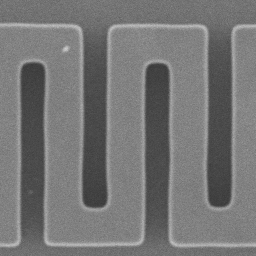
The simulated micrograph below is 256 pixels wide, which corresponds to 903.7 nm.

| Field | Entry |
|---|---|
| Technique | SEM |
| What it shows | groups of lines, slits or small figures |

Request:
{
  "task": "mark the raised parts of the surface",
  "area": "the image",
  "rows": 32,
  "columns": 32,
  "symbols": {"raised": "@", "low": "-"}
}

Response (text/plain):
--------------------------------
--------------------------------
--------------------------------
@@@@@@@@@@----@@@@@@@@@@@@---@@@
@@@@@@@@@@----@@@@@@@@@@@@---@@@
@@@@@@@@@@----@@@@@@@@@@@@---@@@
@@@@@@@@@@----@@@@@@@@@@@@---@@@
@@@@@@@@@@----@@@@@@@@@@@@---@@@
@@@---@@@@----@@@@---@@@@@---@@@
@@@---@@@@----@@@@---@@@@@---@@@
@@@---@@@@---@@@@@---@@@@@---@@@
@@@---@@@@---@@@@@---@@@@@---@@@
@@@---@@@@---@@@@@---@@@@@---@@@
@@@---@@@@---@@@@@---@@@@@---@@@
@@@---@@@@---@@@@@---@@@@@---@@@
@@@---@@@@---@@@@@---@@@@@---@@@
@@@---@@@@---@@@@@---@@@@@---@@@
@@@---@@@@---@@@@@---@@@@@---@@@
@@@---@@@@---@@@@@---@@@@@---@@@
@@@---@@@@---@@@@@---@@@@@---@@@
@@@---@@@@---@@@@@---@@@@@---@@@
@@@---@@@@---@@@@@---@@@@@---@@@
@@@---@@@@---@@@@@---@@@@@---@@@
@@@---@@@@----@@@@---@@@@@---@@@
@@@---@@@@----@@@@---@@@@@---@@@
@@@---@@@@@--@@@@@---@@@@@---@@@
@@----@@@@@@@@@@@@---@@@@@@@@@@@
@@----@@@@@@@@@@@@---@@@@@@@@@@@
@@@---@@@@@@@@@@@@---@@@@@@@@@@@
@@@---@@@@@@@@@@@@---@@@@@@@@@@@
@@----@@@@@@@@@@@-----@@@@@@@@@@
--------------------------------